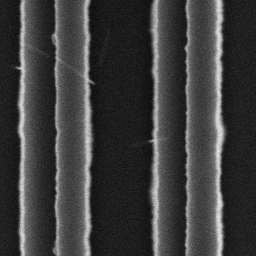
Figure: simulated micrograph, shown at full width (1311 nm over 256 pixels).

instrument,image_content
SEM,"lines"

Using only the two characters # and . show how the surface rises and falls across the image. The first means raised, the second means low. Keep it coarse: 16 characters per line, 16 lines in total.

.####.....####..
.####.....####..
.####.....####..
.####.....####..
.####.....####..
.####.....####..
.####.....####..
.####.....####..
.####.....####..
.####.....####..
.####.....####..
.####.....####..
.####.....####..
.####.....####..
.####.....####..
.####.....####..